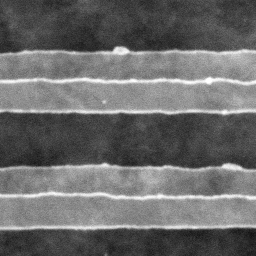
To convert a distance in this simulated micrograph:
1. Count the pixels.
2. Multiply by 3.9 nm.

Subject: lines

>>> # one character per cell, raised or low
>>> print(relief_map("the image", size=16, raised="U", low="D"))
DDDDDDDDDDDDDDDD
DDDDDDDDDDDDDDDD
DDDDDDDDDDDDDDDD
UUUUUUUUUUUUUUUU
UUUUUUUUUUUUUUUU
UUUUUUUUUUUUUUUU
UUUUUUUUUUUUUUUU
DDDDDDDDDDDDDDDD
DDDDDDDDDDDDDDDD
DDDDDDDDDDDDDDDD
DUUUUUUUUUUDDUUD
UUUUUUUUUUUUUUUU
UUUUUUUUUUUUUUUU
UUUUUUUUUUUUUUUU
DDDDDDDDDDDDDDDD
DDDDDDDDDDDDDDDD